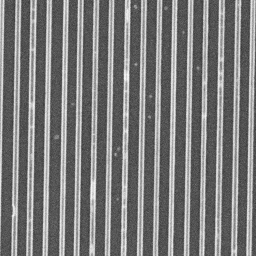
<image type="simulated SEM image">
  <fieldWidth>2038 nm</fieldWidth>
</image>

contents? parallel lines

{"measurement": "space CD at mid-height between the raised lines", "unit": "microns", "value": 0.0896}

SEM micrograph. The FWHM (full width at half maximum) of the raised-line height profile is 29.9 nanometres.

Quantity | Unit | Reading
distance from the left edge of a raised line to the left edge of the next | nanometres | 125